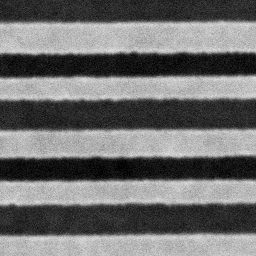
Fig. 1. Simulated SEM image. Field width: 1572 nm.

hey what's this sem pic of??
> lines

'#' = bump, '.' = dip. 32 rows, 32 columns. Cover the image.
................................
................................
................................
################################
################################
################################
###############..#####..#.#.....
................................
................................
................................
################################
################################
................................
................................
................................
................................
..........######################
################################
################################
############################....
................................
................................
................................
################################
################################
..#.............................
................................
................................
................................
.........................##.....
################################
################################